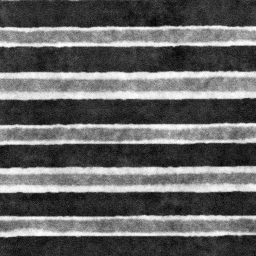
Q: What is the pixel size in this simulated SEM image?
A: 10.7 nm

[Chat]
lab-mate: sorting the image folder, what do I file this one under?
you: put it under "lines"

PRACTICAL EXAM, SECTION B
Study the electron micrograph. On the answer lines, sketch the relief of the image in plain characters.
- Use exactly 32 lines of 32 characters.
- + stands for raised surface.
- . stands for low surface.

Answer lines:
................................
................................
................................
............++++++++++++++++++++
++++++++++++++++++++++++++++++++
+++++++++++++++++++++++++++++...
................................
................................
................................
++++++++++++++++++++++++++++++++
++++++++++++++++++++++++++++++++
++++++++++++++++++++++++++++++++
................................
................................
................................
................................
++++++++++++++++++++++++++++++++
++++++++++++++++++++++++++++++++
................................
................................
................................
++++++++++++++++++++++++++++++++
++++++++++++++++++++++++++++++++
++++++++++++++++++++++++++++++++
................................
................................
................................
++++++++++++++++++++++++++++++++
++++++++++++++++++++++++++++++++
................................
................................
................................